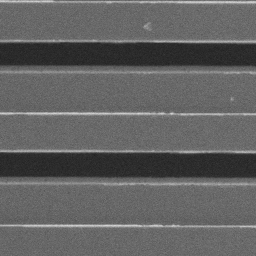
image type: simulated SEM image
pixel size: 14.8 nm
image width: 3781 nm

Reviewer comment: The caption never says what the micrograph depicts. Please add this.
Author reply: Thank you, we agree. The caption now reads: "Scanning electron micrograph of lines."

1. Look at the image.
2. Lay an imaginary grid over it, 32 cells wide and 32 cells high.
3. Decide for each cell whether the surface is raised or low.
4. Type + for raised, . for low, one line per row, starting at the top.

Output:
++++++++++++++++++++++++++++++++
++++++++++++++++++++++++++++++++
++++++++++++++++++++++++++++++++
++++++++++++++++++++++++++++++++
++++++++++++++++++++++++++++++++
................................
................................
................................
................................
++++++++++++++++++++++++++++++++
++++++++++++++++++++++++++++++++
++++++++++++++++++++++++++++++++
++++++++++++++++++++++++++++++++
++++++++++++++++++++++++++++++++
++++++++++++++++++++++++++++++++
++++++++++++++++++++++++++++++++
++++++++++++++++++++++++++++++++
++++++++++++++++++++++++++++++++
++++++++++++++++++++++++++++++++
................................
................................
................................
................................
++++++++++++++++++++++++++++++++
++++++++++++++++++++++++++++++++
++++++++++++++++++++++++++++++++
++++++++++++++++++++++++++++++++
++++++++++++++++++++++++++++++++
++++++++++++++++++++++++++++++++
++++++++++++++++++++++++++++++++
++++++++++++++++++++++++++++++++
++++++++++++++++++++++++++++++++